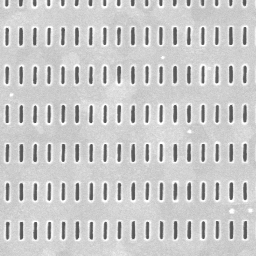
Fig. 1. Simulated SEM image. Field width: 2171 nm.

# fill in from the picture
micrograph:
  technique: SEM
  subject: a regular array of holes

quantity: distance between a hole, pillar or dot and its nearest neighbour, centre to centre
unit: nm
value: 118